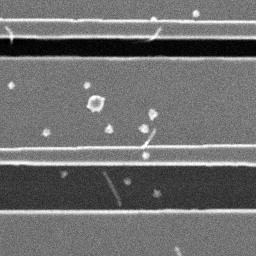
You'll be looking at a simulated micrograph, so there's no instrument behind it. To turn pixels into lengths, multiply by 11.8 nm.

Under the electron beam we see lines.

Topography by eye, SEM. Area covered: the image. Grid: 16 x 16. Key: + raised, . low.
++++++++++++++++
++++++++++++++++
................
................
++++++++++++++++
++++++++++++++++
++++++++++++++++
++++++++++++++++
++++++++++++++++
++++++++++++++++
................
................
................
++++++++++++++++
++++++++++++++++
++++++++++++++++